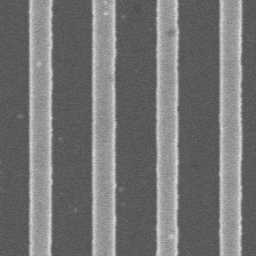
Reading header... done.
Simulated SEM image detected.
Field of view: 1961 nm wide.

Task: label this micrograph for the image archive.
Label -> lines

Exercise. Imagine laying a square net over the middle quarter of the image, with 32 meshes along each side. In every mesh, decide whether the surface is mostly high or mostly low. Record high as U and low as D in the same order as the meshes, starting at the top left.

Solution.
DDDDDDDUUUUUUDDDDDDDDDDUUUUUDDDD
DDDDDDDUUUUUUDDDDDDDDDDUUUUUDDDD
DDDDDDDUUUUUUDDDDDDDDDDUUUUUDDDD
DDDDDDDUUUUUUDDDDDDDDDDUUUUUDDDD
DDDDDDDUUUUUUDDDDDDDDDDUUUUUDDDD
DDDDDDDUUUUUUDDDDDDDDDDUUUUUDDDD
DDDDDDDUUUUUUDDDDDDDDDDUUUUUDDDD
DDDDDDDUUUUUUDDDDDDDDDDUUUUUDDDD
DDDDDDDUUUUUUDDDDDDDDDDUUUUUDDDD
DDDDDDDUUUUUUDDDDDDDDDDUUUUUDDDD
DDDDDDDUUUUUUDDDDDDDDDDUUUUUDDDD
DDDDDDDUUUUUUDDDDDDDDDDUUUUUDDDD
DDDDDDDUUUUUUDDDDDDDDDDUUUUUDDDD
DDDDDDDUUUUUUDDDDDDDDDDUUUUUDDDD
DDDDDDDUUUUUUDDDDDDDDDDUUUUUDDDD
DDDDDDDUUUUUUDDDDDDDDDDUUUUUDDDD
DDDDDDDUUUUUUDDDDDDDDDDUUUUUDDDD
DDDDDDDUUUUUUDDDDDDDDDDUUUUUDDDD
DDDDDDDUUUUUUDDDDDDDDDDUUUUUDDDD
DDDDDDDUUUUUUDDDDDDDDDDUUUUUDDDD
DDDDDDDUUUUUUDDDDDDDDDDUUUUUDDDD
DDDDDDDUUUUUUDDDDDDDDDDUUUUUDDDD
DDDDDDDUUUUUUDDDDDDDDDDUUUUUDDDD
DDDDDDDUUUUUUDDDDDDDDDDUUUUUDDDD
DDDDDDDUUUUUUDDDDDDDDDDUUUUUDDDD
DDDDDDDUUUUUUDDDDDDDDDDUUUUUDDDD
DDDDDDDUUUUUUDDDDDDDDDDUUUUUDDDD
DDDDDDDUUUUUUDDDDDDDDDDUUUUUDDDD
DDDDDDDUUUUUUDDDDDDDDDDUUUUUDDDD
DDDDDDDUUUUUUDDDDDDDDDDUUUUUDDDD
DDDDDDDUUUUUUDDDDDDDDDDUUUUUDDDD
DDDDDDDUUUUUUDDDDDDDDDDUUUUUDDDD